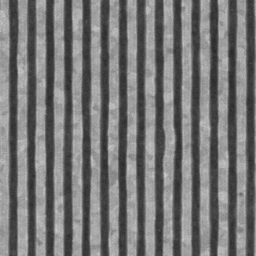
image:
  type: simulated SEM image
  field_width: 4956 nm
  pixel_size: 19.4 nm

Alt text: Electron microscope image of parallel lines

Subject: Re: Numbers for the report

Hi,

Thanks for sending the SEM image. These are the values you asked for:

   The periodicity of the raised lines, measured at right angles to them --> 353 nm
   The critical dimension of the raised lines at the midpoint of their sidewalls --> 0.196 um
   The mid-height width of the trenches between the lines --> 162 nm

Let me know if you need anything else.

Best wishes